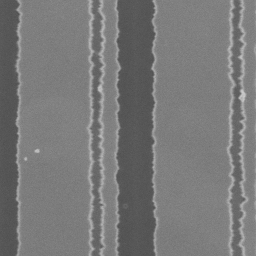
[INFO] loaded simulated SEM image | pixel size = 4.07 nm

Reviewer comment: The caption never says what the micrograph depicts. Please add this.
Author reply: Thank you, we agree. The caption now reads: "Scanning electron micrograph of lines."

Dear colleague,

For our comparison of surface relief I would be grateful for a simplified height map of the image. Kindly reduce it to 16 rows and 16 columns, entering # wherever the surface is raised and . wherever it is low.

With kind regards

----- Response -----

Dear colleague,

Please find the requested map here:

.######...######
.######...######
.######...######
.######...######
.######...######
.######...######
.######...######
.######...######
.######...######
.######...######
.######...######
.######...######
.######...######
.######...######
.######...######
.######...######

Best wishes